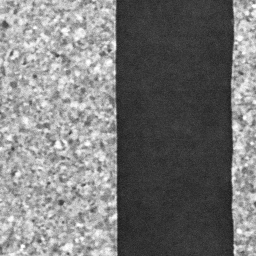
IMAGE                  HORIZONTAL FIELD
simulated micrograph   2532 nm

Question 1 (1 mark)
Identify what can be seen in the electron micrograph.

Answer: one or a few lines or trenches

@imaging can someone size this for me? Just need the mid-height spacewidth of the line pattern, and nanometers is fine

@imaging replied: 1150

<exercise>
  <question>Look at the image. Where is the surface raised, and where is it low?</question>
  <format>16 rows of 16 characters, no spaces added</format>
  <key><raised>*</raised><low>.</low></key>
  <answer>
*******........*
*******........*
*******........*
*******........*
*******........*
*******........*
*******........*
*******........*
*******........*
*******........*
*******........*
*******........*
*******........*
*******........*
*******........*
*******........*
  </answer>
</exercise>